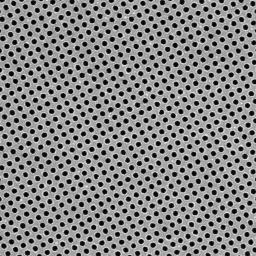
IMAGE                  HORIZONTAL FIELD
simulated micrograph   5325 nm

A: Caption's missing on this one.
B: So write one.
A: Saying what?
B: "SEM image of a regular array of holes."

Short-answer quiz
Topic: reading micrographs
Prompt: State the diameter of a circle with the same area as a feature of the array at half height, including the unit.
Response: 0.117 um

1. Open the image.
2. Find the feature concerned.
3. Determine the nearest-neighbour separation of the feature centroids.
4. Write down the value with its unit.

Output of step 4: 0.177 um